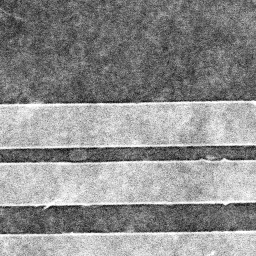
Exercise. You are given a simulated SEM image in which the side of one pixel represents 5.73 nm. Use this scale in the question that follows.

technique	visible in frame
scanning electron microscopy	one or a few lines or trenches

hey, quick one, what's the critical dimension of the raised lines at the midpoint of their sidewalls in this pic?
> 241 nanometres